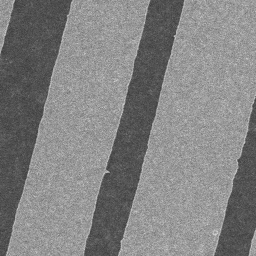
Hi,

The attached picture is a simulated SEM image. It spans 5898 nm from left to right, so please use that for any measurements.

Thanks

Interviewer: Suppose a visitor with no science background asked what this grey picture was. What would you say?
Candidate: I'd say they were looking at one or a few lines or trenches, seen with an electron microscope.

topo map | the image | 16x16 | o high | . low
o...ooooo..ooooo
o...ooooo..ooooo
....ooooo..ooooo
....oooo...ooooo
...ooooo..oooooo
...ooooo..oooooo
...ooooo..oooooo
...oooo...oooooo
..ooooo..oooooo.
..ooooo..oooooo.
..ooooo..oooooo.
..oooo...oooooo.
.ooooo..oooooo..
.ooooo..oooooo..
.ooooo..oooooo..
.oooo...ooooo...